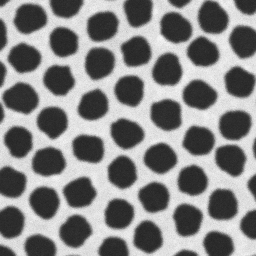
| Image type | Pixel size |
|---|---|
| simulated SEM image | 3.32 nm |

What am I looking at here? a regular array of holes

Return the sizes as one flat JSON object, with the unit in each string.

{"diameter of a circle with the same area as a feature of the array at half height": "106 nm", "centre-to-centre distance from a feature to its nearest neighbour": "127 nanometres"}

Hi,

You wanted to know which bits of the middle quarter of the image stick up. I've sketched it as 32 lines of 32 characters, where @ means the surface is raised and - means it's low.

-@@@@--------@@@---@@@-------@@@
--@@@-------@@@@@@@@@@--------@@
--@@@@------@@@@@@@@@@--------@@
---@@@@---@@@@-----@@@-------@@@
---@@@@@@@@@@-------@@@------@@-
---@@@@@@@@@@-------@@@@@@@-@@--
--@@@@@@-@@@--------@@@@@@@@@@--
-@@@@-----@@@-------@@@@@@@@@@--
@@@@-------@@-------@@@@@@@@@@--
@@@@-------@@@-----@@@@-----@@--
@@@--------@@@@@--@@@@-------@@-
@@@--------@@@@@@@@@@--------@@@
-@@@-------@@@@@@@@@@@-------@@@
-@@@@----@@@@@@@@@@@@@-------@@@
-@@@@@@@@@@@@-----@@@@-------@@@
-@@@@@@@@@@@-------@@@@------@@@
-@@@@@@@@@@@--------@@@@---@@@@-
@@@@-@@@@@@@--------@@@@@@@@@@--
@@@------@@@--------@@@@@@@@@@--
@@--------@@-------@@@@@@@@@@@--
@@--------@@@-----@@@@----@@@@--
@@--------@@@@@-@@@@@------@@@--
@@--------@@@@@@@@@@--------@@@@
@@@-------@@@---@@@@--------@@@@
@@@@@@---@@@-----@@@--------@@@@
-@@@@@@@@@@-------@@--------@@@-
@@@@@@@@@@@-------@@@@----@@@---
@@@@@@@@@@@-------@@@@@--@@@@---
@@@---@@@@@-------@@@@@@@@@@----
@@-----@@@@-------@@@@-@@@@@----
-------@@@@@@----@@@-----@@@----
--------@@@@@@@@@@@-------@@@---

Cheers